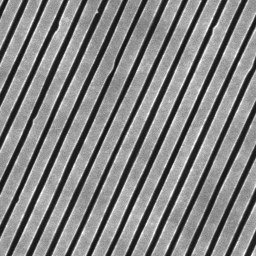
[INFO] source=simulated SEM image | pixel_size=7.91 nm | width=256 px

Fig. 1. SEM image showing parallel lines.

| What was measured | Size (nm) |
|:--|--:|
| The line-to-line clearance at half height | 38.7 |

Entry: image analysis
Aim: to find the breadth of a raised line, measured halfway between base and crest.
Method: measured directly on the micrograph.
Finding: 98.9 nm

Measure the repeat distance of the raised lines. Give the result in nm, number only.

143